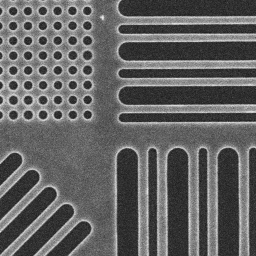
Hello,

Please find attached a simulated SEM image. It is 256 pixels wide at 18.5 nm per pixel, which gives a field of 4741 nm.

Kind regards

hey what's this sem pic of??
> groups of lines, slits or small figures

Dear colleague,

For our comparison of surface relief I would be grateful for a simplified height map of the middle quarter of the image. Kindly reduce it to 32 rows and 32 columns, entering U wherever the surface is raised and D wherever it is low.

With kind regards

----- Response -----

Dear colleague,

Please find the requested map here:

UUDUUDDUUUUUUUUUUUUUUUUUUUUUUUUU
UDDUUDDUUUUUUUDDDDDDDDDDDDDDDDDD
UUDUUDDUUUUUUUDDDDDDDDDDDDDDDDDD
UUUUUUUUUUUUUUUDDDDDDDDDDDDDDDDD
UDDUUDDUUUUUUUUUUUUUUUUUUUUUUUUU
UDDUUDDUUUUUUUUDDDDDDDDDDDDDDDDD
UUUUUUUUUUUUUUDDDDDDDDDDDDDDDDDD
UUUUUUUUUUUUUDDDDDDDDDDDDDDDDDDD
UDDUUDDUUUUUUUDDDDDDDDDDDDDDDDDD
UDDUUDDUUUUUUUDDDDDDDDDDDDDDDDDD
UUUUUUUUUUUUUUUUUUUUUUUUUUUUUUUU
UUUUUUUUUUUUUUUUUUUUUUUUUUUUUUUU
UDDUUDDUUUUUUUDDDDDDDDDDDDDDDDDD
UDDUUDDUUUUUUDDDDDDDDDDDDDDDDDDD
UUUUUUUUUUUUUUDDDDDDDDDDDDDDDDDD
UUUUUUUUUUUUUUUUUUUUUUUUUUUUUUUU
UUUUUUUUUUUUUUUUUUUUUUUUUUUUUUUU
UUUUUUUUUUUUUUUUUUUUUUUUUUUUUUUU
UUUUUUUUUUUUUUUUUUUUUUUUUUUUUUUU
UUUUUUUUUUUUUUUUUUUUUUUUUUUUUUUU
UUUUUUUUUUUUUUUUUUUUUUUUUUUUUUUU
UUUUUUUUUUUUUUDDDUUUUDDUUUUDDDUU
UUUUUUUUUUUUUDDDDDUUUDDUUUDDDDDU
UUUUUUUUUUUUUDDDDDDUUDDUUUDDDDDU
UUUUUUUUUUUUUDDDDDDUUDDUUUDDDDDU
UUUUUUUUUUUUUDDDDDDUUDDUUUDDDDDU
UUUUUUUUUUUUUDDDDDDUUDDUUUDDDDDU
UUUUUUUUUUUUUDDDDDDUUDDUUUDDDDDU
UUUUUUUUUUUUUDDDDDDUUDDUUUDDDDDU
UUUUUUUUUUUUUDDDDDDUUDDUUUDDDDDU
UUUUUUUUUUUUUDDDDDDUUDDUUUDDDDDU
UUUUUUUUUUUUUDDDDDDUUDDUUUDDDDDU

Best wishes